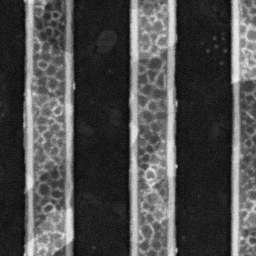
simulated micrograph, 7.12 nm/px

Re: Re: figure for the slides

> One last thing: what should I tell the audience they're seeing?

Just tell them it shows one or a few lines or trenches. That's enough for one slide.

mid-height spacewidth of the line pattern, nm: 468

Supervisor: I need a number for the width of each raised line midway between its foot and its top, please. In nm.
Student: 262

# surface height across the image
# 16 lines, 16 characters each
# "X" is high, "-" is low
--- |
--XX----XXX----X
--XX----XXX----X
--XX----XXX----X
--XX----XXX----X
--XX----XXX----X
--XX----XXX----X
--XX----XXX----X
--XX----XXX----X
--XX----XXX----X
--XX----XXX----X
--XX----XXX----X
--XX----XXX----X
--XX----XXX----X
--XX----XXX----X
--XX----XXX----X
--XX----XXX----X